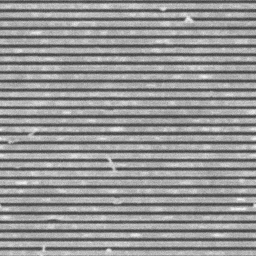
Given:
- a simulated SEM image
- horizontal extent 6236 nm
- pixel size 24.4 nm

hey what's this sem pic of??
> parallel lines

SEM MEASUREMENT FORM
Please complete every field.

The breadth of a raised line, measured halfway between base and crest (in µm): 0.116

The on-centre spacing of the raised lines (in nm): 214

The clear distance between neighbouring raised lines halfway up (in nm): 91.4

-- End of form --